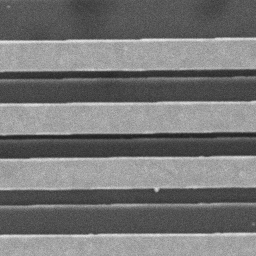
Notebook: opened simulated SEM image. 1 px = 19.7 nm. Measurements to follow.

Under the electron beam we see lines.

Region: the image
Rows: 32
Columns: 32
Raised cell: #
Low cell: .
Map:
................................
................................
................................
................................
................................
################################
################################
################################
################################
................................
................................
................................
................................
################################
################################
################################
###########################.....
................................
................................
................................
################################
################################
################################
################................
................................
................................
................................
................................
................................
################################
################################
################################